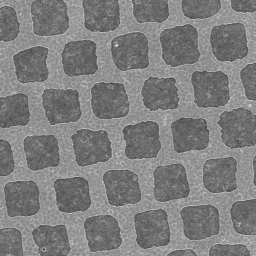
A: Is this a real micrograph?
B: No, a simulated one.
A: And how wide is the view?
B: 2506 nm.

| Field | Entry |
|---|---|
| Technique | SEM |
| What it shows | a regular array of holes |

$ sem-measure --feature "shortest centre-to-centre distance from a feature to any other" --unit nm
478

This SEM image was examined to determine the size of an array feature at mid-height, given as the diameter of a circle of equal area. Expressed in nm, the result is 378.